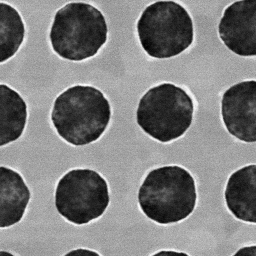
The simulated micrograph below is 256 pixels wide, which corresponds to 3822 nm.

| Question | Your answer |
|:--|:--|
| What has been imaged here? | holes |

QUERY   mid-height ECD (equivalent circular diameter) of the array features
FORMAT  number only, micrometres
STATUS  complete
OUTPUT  0.858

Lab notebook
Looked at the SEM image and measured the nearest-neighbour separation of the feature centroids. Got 1230 nm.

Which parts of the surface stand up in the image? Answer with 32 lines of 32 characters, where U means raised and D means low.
DUUUUUUUDDDUUUUUUUUDDDUUUUUUUDDD
DDUUUUUDDDDDDUUUUUDDDDDUUUUUDDDD
DDDUUUUDDDDDDUUUUDDDDDDDUUUUDDDD
DDDUUUDDDDDDDUUUUDDDDDDDUUUDDDDD
DDDUUUDDDDDDDUUUUDDDDDDDUUUDDDDD
DDDUUUDDDDDDDUUUUUDDDDDDUUUUDDDD
DDUUUUUDDDDDUUUUUUDDDDDUUUUUUDDD
DUUUUUUUUDUUUUUUUUUUUUUUUUUUUUUU
UUUUUUUUUUUUUUUUUUUUUUUUUUUUUUUU
UUUUUUUUUUUUUUUUUUUUUUUUUUUUUUUU
UUUUUUUUUUUUUUUUUUUUDUUUUUUUUUDD
DDUUUUUUDDDDDUUUUUDDDDDUUUUUDDDD
DDDUUUUDDDDDDUUUUUDDDDDDUUUUDDDD
DDDUUUUDDDDDDDUUUDDDDDDDUUUUDDDD
DDDUUUDDDDDDDDUUUDDDDDDDUUUUDDDD
DDDUUUUDDDDDDUUUUDDDDDDDUUUUDDDD
DDDUUUUDDDDDDUUUUUDDDDDUUUUUUDDD
DDUUUUUUDDDDUUUUUUUUDUUUUUUUUUDD
UUUUUUUUUUUUUUUUUUUUUUUUUUUUUUUU
UUUUUUUUUUUUUUUUUUUUUUUUUUUUUUUU
UUUUUUUUUUUUUUUUUUUUUUUUUUUUUUUU
DDUUUUUUUDDDUUUUUUUDDDDDUUUUUDDD
DDDUUUUUDDDDDUUUUUDDDDDDUUUUUDDD
DDDUUUUDDDDDDDUUUUDDDDDDUUUUDDDD
DDDDUUUDDDDDDDUUUDDDDDDDDUUUDDDD
DDDUUUUDDDDDDDUUUDDDDDDDUUUUDDDD
DDDUUUUDDDDDDUUUUUDDDDDDUUUUUDDD
DDUUUUUUDDDDUUUUUUUDDDDUUUUUUUDD
UUUUUUUUUUUUUUUUUUUUUUUUUUUUUUUU
UUUUUUUUUUUUUUUUUUUUUUUUUUUUUUUU
UUUUUUUUUUUUUUUUUUUUUUUUUUUUUUUU
DUUUUUUUUDDDUUUUUUUUDDDUUUUUUUDD